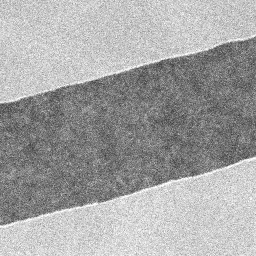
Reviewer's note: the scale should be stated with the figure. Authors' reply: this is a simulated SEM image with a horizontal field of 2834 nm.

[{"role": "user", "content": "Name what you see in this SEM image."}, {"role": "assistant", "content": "one or a few lines or trenches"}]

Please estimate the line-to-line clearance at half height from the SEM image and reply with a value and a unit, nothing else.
1330 nanometres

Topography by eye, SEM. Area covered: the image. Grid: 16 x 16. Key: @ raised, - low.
@@@@@@@@@@@@@@@@
@@@@@@@@@@@@@@@@
@@@@@@@@@@@@@@@-
@@@@@@@@@@@-----
@@@@@@@---------
@@@@------------
----------------
----------------
----------------
----------------
--------------@@
----------@@@@@@
-------@@@@@@@@@
---@@@@@@@@@@@@@
@@@@@@@@@@@@@@@@
@@@@@@@@@@@@@@@@